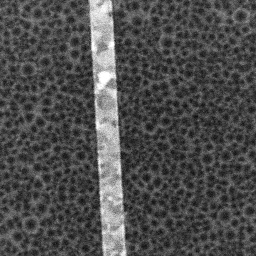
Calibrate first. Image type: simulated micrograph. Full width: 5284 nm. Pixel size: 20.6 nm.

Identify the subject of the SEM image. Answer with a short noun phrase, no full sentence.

one or a few lines or trenches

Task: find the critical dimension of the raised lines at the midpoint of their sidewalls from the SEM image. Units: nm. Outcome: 448